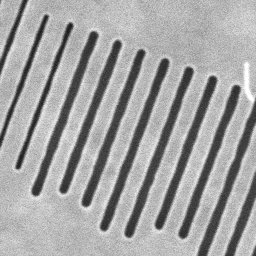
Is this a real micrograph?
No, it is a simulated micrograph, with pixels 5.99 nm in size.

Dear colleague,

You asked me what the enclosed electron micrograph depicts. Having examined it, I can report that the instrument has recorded groups of lines, slits or small figures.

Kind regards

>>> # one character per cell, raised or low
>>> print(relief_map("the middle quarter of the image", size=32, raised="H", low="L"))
HHHLLLHHHHLLLHHHHLLLHHHHLLHHHHHH
HHHLLLHHHHLLLHHHLLLHHHHLLLHHHHLL
HHLLLHHHHLLLHHHHLLLHHHHLLLHHHHLL
HHLLLHHHHLLLHHHHLLHHHHLLLHHHHLLL
HHLLHHHHLLLHHHHLLLHHHHLLLHHHHLLL
HLLLHHHHLLLHHHHLLLHHHHLLHHHHHLLH
HLLLHHHHLLHHHHHLLHHHHLLLHHHHLLLH
HLLHHHHHLLHHHHLLLHHHHLLLHHHHLLHH
LLLHHHHLLLHHHHLLLHHHHLLHHHHLLLHH
LLLHHHHLLHHHHLLLHHHHLLLHHHHLLLHH
LLHHHHLLLHHHHLLLHHHHLLHHHHHLLHHH
LLHHHHLLHHHHHLLHHHHHLLHHHHLLLHHH
LHHHHHLLHHHHLLLHHHHLLLHHHHLLLHHH
LHHHHLLLHHHHLLLHHHHLLLHHHHLLHHHH
LHHHHLLLHHHHLLHHHHLLLHHHHLLLHHHH
LHHHLLLHHHHLLLHHHHLLLHHHHLLLHHHH
HHHHLLLHHHHLLLHHHHLLHHHHLLLHHHHL
HHHHLLHHHHLLLHHHHLLLHHHHLLLHHHHL
HHHLLLHHHHLLLHHHHLLLHHHHLLLHHHLL
HHHLLLHHHHLLLHHHHLLHHHHLLLHHHHLL
HHHLLHHHHLLLHHHHLLLHHHHLLLHHHHLL
HHLLLHHHHLLLHHHHLLHHHHHLLHHHHLLL
HHLLLHHHLLLHHHHLLLHHHHLLLHHHHLLL
HLLLHHHHLLLHHHHLLLHHHHLLLHHHHLLH
HLLLHHHHLLLHHHHLLHHHHLLLHHHHLLLH
HLLHHHHHLLHHHHLLLHHHHLLLHHHHLLLH
LLLHHHHLLLHHHHLLLHHHHLLLHHHHLLHH
LLLHHHHLLLHHHHLLHHHHLLLHHHHLLLHH
LLHHHHLLLHHHHLLLHHHHLLLHHHHLLHHH
LLHHHHLLLHHHHLLLHHHHLLHHHHHLLHHH
LLHHHHLLHHHHLLLHHHHLLLHHHHLLLHHH
LHHHHLLLHHHHLLLHHHHLLLHHHHLLHHHH